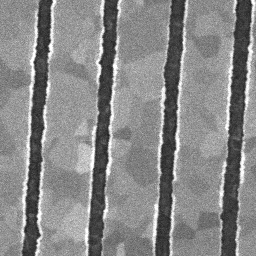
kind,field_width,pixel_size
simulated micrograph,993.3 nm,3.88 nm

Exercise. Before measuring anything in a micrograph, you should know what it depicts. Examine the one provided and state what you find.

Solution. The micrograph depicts one or a few lines or trenches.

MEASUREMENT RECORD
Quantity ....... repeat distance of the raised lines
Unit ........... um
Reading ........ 0.256